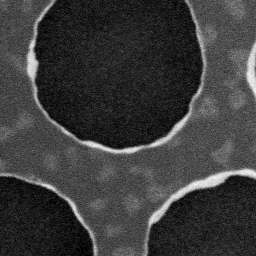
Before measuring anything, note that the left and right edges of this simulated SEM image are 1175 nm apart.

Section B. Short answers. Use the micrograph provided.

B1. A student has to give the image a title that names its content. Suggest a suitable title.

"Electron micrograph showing holes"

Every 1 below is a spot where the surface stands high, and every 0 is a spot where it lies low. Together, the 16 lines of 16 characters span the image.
1110000000001111
1100000000001111
1100000000001111
1100000000000111
1100000000000111
1100000000001111
1110000000001111
1110000000011111
1111100000011111
1111111111111111
1111111111111111
0011111111111000
0000111111100000
0000011111000000
0000001110000000
0000001110000000